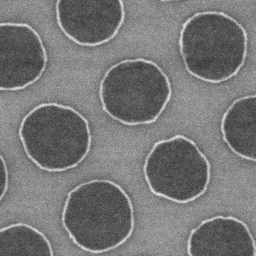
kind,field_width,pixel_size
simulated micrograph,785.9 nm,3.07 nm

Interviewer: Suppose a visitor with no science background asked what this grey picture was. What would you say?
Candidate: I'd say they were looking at raised bodies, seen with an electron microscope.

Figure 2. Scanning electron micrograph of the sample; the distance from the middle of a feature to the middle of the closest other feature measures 276 nm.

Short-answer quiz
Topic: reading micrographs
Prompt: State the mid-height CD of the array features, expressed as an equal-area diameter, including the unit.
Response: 208 nm